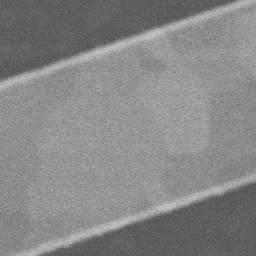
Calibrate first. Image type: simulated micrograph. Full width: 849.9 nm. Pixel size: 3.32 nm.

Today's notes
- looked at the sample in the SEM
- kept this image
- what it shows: one or a few lines or trenches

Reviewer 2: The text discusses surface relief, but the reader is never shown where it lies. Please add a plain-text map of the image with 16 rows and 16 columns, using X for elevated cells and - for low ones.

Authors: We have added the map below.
--------------XX
-----------XXXXX
--------XXXXXXXX
------XXXXXXXXXX
---XXXXXXXXXXXXX
XXXXXXXXXXXXXXXX
XXXXXXXXXXXXXXXX
XXXXXXXXXXXXXXXX
XXXXXXXXXXXXXXXX
XXXXXXXXXXXXXXXX
XXXXXXXXXXXXXXXX
XXXXXXXXXXXXXXX-
XXXXXXXXXXXX----
XXXXXXXXX-------
XXXXXX----------
XXX-------------